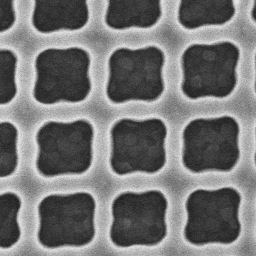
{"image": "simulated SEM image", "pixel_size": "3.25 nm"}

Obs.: a regular array of holes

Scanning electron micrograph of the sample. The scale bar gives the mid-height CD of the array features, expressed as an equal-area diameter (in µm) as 0.194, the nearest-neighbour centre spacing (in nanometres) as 235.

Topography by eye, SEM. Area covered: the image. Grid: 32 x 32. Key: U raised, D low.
DDUUDDDDDDDUUUDDDDDDUUUDDDDDDUUU
DDUUDDDDDDDUUDDDDDDDUUDDDDDDDUUD
DDUUDDDDDDDUUDDDDDDDUUDDDDDDDUUU
DUUUDDDDDDUUUUDDUUUUUUUDDUUUUUUU
UUUUUUUUUUUUUUUUUUUUUUUUUUUUUUUU
UUUUUUUUUUUUUUUUUUUUUUUUUUUDDUUU
DDUUUDDDDDDUUUDDDDDDUUUDDDDDDDUU
DDUUDDDDDDDUUUDDDDDDDUUDDDDDDDUU
DDUUDDDDDDDUUUDDDDDDUUUDDDDDDDUU
DDUUUDDDDDDUUUDDDDDDUUUDDDDDDDUU
DDUUDDDDDDDUUDDDDDDDUUUDDDDDDUUU
DDUUDDDDDDDUUDDDDDDDUUUDDDDDDUUU
DUUUUDDDDDUUUUDDDDDUUUUUUUUUUUUU
UUUUUUUUUUUUUUUUUUUUUUUUUUUUUUUU
UUUUUUUUUUUUUUUUUUUUUUUUUUUUUUUU
DUUUUUDDDDDUUUDDDDDDDUUUDDDDDDUU
DDUUUDDDDDDDUUDDDDDDDUUDDDDDDDUU
DDUUUDDDDDDDUUDDDDDDDUUDDDDDDDUU
DDUUUDDDDDDDUUDDDDDDDUUDDDDDDDUU
DDUUUDDDDDDDUUDDDDDDDUUDDDDDDDUU
DDUUUDDDDDDUUUDDDDDDDUUDDDDDDUUU
DDUUUDDDDDDUUUDDDUDUUUUUDUUUUUUU
UUUUUUUUUUUUUUUUUUUUUUUUUUUUUUUU
UUUUUUUUUUUUUUUUUUUUUUUUUUUUDUUU
DDUUUUDDDDDUUUUDDDDDDUUUDDDDDDUU
DDDUUDDDDDDDUUDDDDDDDUUDDDDDDDUU
DDUUUDDDDDDDUUDDDDDDDUUDDDDDDDUU
DDUUUDDDDDDDUUDDDDDDDUUDDDDDDDUU
DDUUUDDDDDDDUUDDDDDDDUUDDDDDDDUU
DDUUUDDDDDDDUUDDDDDDDUUDDDDDDDUU
DDUUUDDDDDDUUUDDDDDDUUUUDDUUUUUU
UUUUUUUUUUUUUUUUUUUUUUUUUUUUUUUU